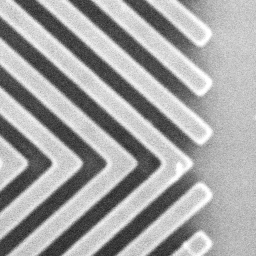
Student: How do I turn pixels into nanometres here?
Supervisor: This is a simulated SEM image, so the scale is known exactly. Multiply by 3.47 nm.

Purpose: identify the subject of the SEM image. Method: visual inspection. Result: groups of lines, slits or small figures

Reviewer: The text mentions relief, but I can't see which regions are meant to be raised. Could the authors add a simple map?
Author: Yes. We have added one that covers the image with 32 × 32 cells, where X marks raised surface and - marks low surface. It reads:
XX---XXXX---XXXX---XXX----------
XXX---XXXX---XXXX---XXX---------
-XXX----XXX---XXXX---XXXX-------
--XXX----XXX---XXXX---XXXX------
---XXX----XXX----XXX---XXX------
X---XXXX---XXX----XXX-----------
XX---XXXX---XXX----XXX----------
XXX---XXXX---XXXX---XXX---------
-XXX---XXXX---XXXX---XXX--------
--XXX----XXX---XXXX---XXXX------
---XXX----XXX---XXXX---XXX------
X---XXX----XXX----XXX---X-------
XX---XXXX---XXX----XXX----------
XXX---XXXX---XXX----XXX---------
XXXX---XXXX---XXXX---XXX--------
--XXX---XXXX---XXXX---XXX-------
---XXX----XXX---XXXX---XXX------
----XXX----XXX---XXXX---XX------
XX---XXX----XXX---XXXX----------
XXX---XXXX---XXX----XXX---------
XXX----XXX---XXXX---XXXX--------
XXX---XXX----XXX----XXX---------
X----XXX----XXX---XXXX----------
----XXX---XXXX---XXXX---XX------
---XXX---XXXX---XXXX---XXX------
-XXXX---XXXX---XXXX---XXX-------
XXXX---XXXX---XXX----XXX--------
XXX---XXX----XXX----XXX---------
XX---XXX----XXX----XXX----------
----XXX----XXX---XXXX---XX------
---XXX---XXXX---XXXX---XXX------
--XXX---XXXX---XXXX---XXX-------